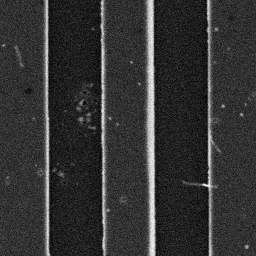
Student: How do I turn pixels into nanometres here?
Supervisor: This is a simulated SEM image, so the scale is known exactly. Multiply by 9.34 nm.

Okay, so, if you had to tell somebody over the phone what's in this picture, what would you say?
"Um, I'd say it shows lines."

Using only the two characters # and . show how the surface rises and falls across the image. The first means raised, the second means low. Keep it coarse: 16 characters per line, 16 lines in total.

###...###....###
###...###....###
###...###....###
###...###....###
###...####...###
###...####...###
###...####...###
###...####...###
###...####...###
###...####...###
###...####...###
###...####...###
###...####...###
###...####...###
###...####...###
###...####...###